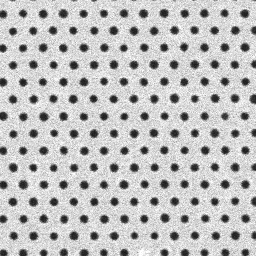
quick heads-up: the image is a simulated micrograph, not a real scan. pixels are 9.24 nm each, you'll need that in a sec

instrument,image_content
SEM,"a regular array of holes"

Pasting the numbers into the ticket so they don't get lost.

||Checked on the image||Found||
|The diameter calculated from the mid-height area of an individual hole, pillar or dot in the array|0.0801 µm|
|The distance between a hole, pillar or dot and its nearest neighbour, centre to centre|180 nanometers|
